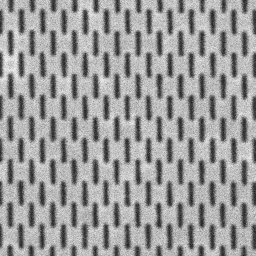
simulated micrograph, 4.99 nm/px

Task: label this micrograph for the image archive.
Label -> a regular array of holes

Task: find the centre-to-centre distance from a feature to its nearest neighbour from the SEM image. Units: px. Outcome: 21.1